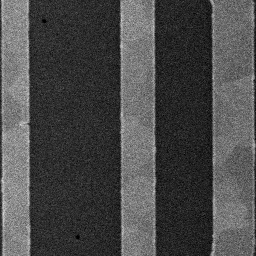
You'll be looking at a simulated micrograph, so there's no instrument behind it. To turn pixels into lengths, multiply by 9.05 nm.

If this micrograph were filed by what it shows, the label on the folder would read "one or a few lines or trenches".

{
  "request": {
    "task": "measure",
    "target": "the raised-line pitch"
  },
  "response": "989 nm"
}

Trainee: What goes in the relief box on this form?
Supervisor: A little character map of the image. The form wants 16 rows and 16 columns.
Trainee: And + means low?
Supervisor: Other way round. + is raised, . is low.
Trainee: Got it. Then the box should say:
++......++...+++
++......++...+++
++......++...+++
++......++...+++
++......++...+++
++......++...+++
++......++...+++
++......++...+++
++......++...+++
++......++...+++
++......++...+++
++......++...+++
++......++...+++
++......++...+++
++......++...+++
++......++...+++